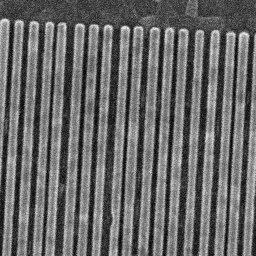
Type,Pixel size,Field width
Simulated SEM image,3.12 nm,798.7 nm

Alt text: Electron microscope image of parallel lines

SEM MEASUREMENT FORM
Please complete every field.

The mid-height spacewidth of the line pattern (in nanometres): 21.8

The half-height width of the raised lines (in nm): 24.9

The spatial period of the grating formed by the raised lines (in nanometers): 46.8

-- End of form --